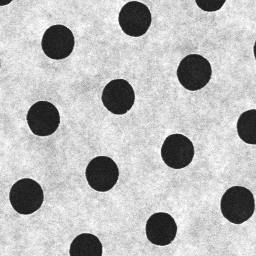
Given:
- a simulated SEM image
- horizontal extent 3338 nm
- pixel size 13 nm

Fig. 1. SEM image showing a regular array of holes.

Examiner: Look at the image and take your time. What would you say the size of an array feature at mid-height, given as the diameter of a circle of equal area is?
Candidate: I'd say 449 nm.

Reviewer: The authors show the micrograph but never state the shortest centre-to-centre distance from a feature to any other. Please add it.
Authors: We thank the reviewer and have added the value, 1.03 micrometres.